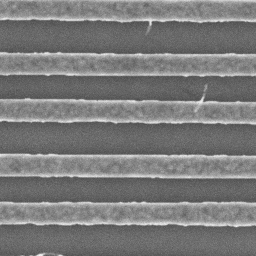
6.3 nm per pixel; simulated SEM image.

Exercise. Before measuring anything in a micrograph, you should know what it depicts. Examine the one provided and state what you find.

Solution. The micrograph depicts lines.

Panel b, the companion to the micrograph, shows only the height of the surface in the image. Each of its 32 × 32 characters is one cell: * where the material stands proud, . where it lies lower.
********************************
********************************
.......*****.*******************
................................
................................
................................
................................
********************************
********************************
................................
................................
................................
***********.....................
********************************
********************************
................................
................................
................................
................................
*****************************...
********************************
********************************
................................
................................
................................
********************************
********************************
********************************
................................
................................
................................
................................